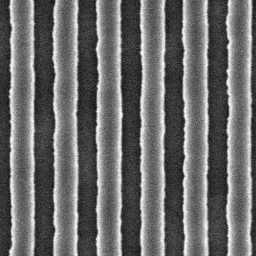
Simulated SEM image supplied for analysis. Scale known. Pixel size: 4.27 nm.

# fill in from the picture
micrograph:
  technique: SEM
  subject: lines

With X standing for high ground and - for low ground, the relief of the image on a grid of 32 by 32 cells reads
-XXX---XXX--XXX---XXX--XXX---XX-
-XXX---XXX--XXX---XX---XXX---XX-
-XXX---XXX--XXX---XXX--XXX--XXX-
-XXX---XXX--XXX---XXX--XXX--XXX-
-XXX---XXX--XXX---XXX--XXX---XX-
-XXX---XXX--XXX---XXX--XXX---XX-
-XXX---XXX--XXX---XXX--XXX---XX-
-XXX---XXX--XXX---XX---XXX---XX-
-XXX---XXX--XXX---XX---XXX---XX-
-XXX---XXX--XXX---XX---XXX---XX-
-XXX---XXX--XXX---XX---XXX---XX-
-XXX---XXX--XXX---XX---XXX---XX-
-XXX---XXX--XXX---XX---XXX---XX-
-XXX---XX---XXX---XX---XXX---XX-
-XXX---XX---XXX---XX---XXX---XX-
-XXX---XX---XXX---XX---XXX---XX-
-XXX---XXX--XXX---XXX--XXX--XXX-
-XXX---XXX--XXX---XX---XXX---XX-
-XXX---XXX--XXX---XX---XXX---XX-
-XXX---XXX--XXX---XX---XXX---XX-
-XXX---XXX--XXX---XX---XXX---XX-
-XXX---XXX--XXX---XX---XXX---XX-
-XXX---XXX--XXX---XX---XXX---XX-
-XXX---XXX--XXX---XX---XXX---XX-
-XXX---XXX--XXX---XX---XXX---XX-
-XXX---XXX--XXX---XX---XXX--XXX-
-XXX---XXX--XXX---XX---XXX--XXX-
-XXX---XXX--XXX---XX---XXX--XXX-
-XXX---XXX--XXX---XX---XXX---XX-
-XXX---XXX--XXX---XX---XXX---XX-
-XXX---XXX--XXX---XX---XXX---XX-
-XXX---XXX--XXX---XX---XXX---XX-